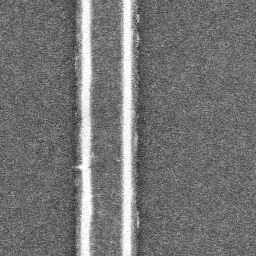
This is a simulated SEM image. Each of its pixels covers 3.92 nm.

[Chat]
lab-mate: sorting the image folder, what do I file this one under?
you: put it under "one or a few lines or trenches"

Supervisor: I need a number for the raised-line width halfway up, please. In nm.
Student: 164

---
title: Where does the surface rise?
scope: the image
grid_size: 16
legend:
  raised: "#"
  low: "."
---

.....###........
.....###........
.....###........
.....###........
.....###........
.....###........
.....###........
.....###........
.....###........
.....###........
.....###........
.....###........
.....###........
.....###........
.....###........
.....###........